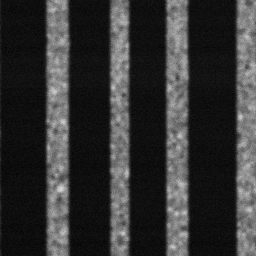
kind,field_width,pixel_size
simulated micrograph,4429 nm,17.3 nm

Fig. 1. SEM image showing one or a few lines or trenches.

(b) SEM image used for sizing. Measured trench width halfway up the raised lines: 748 nm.